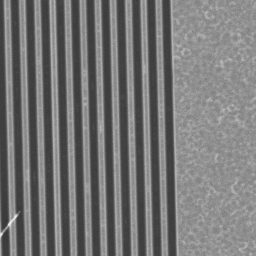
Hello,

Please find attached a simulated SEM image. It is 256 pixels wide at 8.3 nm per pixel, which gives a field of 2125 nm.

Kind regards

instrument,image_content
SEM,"parallel lines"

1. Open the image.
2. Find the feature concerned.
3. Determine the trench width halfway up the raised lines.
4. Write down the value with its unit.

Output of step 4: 0.0674 µm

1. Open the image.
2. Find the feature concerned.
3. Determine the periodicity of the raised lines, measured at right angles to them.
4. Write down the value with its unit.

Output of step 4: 15.1 pixels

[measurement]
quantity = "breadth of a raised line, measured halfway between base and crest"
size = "0.0602 micrometres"